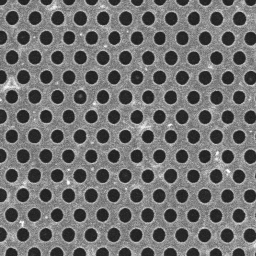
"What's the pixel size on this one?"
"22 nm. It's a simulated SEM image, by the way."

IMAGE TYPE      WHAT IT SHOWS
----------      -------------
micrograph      a regular array of holes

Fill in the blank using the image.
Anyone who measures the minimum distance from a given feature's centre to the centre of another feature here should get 491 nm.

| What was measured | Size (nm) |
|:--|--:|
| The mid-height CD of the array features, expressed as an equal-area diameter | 299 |